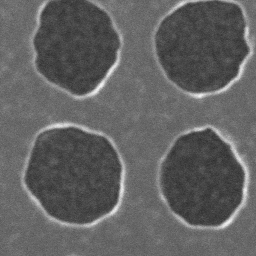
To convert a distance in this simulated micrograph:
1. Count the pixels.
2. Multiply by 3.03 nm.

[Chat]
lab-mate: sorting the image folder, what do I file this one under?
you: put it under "holes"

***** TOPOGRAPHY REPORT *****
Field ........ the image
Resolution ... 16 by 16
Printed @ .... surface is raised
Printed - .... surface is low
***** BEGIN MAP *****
@@@---@@@@@----@
@@-----@@@-----@
@@-----@@@-----@
@@-----@@@-----@
@@-----@@@-----@
@@@@--@@@@@---@@
@@@@@@@@@@@@@@@@
@@@@@@@@@@@@@@@@
@@----@@@@@---@@
@@-----@@@@----@
@@------@@-----@
@@------@@-----@
@@-----@@@-----@
@@@---@@@@@---@@
@@@@@@@@@@@@@@@@
@@@@@@@@@@@@@@@@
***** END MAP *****